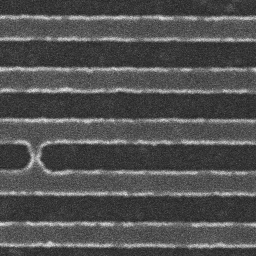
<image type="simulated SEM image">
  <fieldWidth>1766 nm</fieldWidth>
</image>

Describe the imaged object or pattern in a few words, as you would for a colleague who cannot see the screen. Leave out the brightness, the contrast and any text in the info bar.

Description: parallel lines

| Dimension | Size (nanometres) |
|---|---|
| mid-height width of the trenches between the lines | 188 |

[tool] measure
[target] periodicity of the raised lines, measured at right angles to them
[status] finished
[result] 0.356 microns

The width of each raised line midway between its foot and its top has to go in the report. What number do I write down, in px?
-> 24.6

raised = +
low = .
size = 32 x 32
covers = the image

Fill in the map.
................................
................................
++++++++++++++++++++++++++++++++
++++++++++++++++++++++++++++++++
++++++++++++++++++++++++++++++++
................................
................................
................................
+++.+++++++..++++.++............
++++++++++++++++++++++++++++++++
++++++++++++++++++++++++++++++++
...+++++++++++..++++++++++++++++
................................
................................
................................
++++++++++++++++++++++++++++++++
++++++++++++++++++++++++++++++++
++++++++++++++++++++++++++++++++
....+...........................
....+...........................
....+...........................
+++++++.+++++++++++++++++++....+
++++++++++++++++++++++++++++++++
++++++++++++++++++++++++++++++++
................................
................................
................................
................................
++++++++++++++++++++++++++++++++
++++++++++++++++++++++++++++++++
++++++++++++++++++++++++++++++++
................................